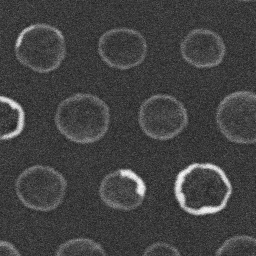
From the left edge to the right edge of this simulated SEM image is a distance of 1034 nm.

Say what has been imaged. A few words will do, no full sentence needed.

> a regular array of raised bodies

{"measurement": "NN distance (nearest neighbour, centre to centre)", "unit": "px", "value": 79.8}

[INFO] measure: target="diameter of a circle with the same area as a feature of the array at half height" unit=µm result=0.184